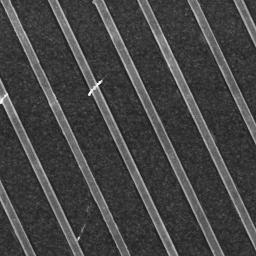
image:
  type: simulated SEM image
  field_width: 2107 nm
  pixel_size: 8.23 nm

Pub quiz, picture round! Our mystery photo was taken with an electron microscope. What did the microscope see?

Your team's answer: parallel lines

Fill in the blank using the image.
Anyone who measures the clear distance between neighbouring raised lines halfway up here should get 286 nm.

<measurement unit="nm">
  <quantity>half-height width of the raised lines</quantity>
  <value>65.1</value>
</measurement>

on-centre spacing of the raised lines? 0.346 microns